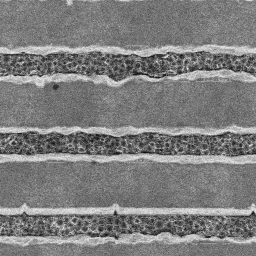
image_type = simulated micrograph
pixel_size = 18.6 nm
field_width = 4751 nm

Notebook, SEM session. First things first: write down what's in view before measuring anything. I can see one or a few lines or trenches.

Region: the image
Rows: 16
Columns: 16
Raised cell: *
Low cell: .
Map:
****************
****************
****************
................
................
****************
****************
****************
................
................
****************
****************
****************
................
................
****************